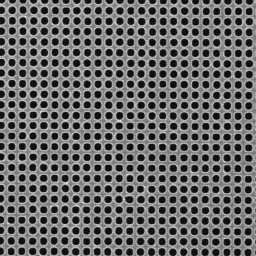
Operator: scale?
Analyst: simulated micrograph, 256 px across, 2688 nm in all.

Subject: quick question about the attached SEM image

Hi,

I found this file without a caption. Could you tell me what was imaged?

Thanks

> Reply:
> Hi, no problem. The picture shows a regular array of holes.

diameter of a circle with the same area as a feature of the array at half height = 7.57 pixels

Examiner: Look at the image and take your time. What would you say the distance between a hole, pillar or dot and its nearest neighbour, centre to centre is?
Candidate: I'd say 106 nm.